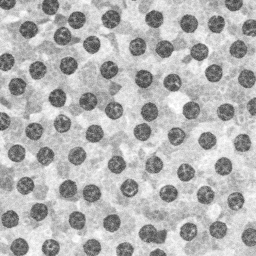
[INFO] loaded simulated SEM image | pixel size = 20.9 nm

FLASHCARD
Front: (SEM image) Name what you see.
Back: a regular array of holes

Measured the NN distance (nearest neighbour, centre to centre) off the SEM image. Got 598 nm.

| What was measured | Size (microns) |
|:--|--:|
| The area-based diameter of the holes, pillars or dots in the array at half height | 0.396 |